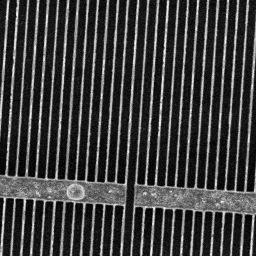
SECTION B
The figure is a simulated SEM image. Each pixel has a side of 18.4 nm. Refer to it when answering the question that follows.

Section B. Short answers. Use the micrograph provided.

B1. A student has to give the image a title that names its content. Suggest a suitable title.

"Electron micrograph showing parallel lines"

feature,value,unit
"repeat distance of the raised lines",184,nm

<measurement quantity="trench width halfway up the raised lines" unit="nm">143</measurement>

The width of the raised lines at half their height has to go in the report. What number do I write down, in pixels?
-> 2